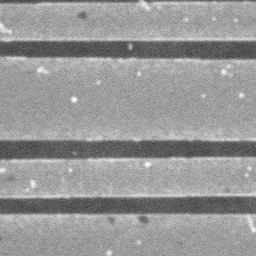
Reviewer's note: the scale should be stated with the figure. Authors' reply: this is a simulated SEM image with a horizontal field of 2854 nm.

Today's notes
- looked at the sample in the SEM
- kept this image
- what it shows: lines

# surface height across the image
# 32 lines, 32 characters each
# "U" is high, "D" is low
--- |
DDDDDUUUUUUUUUUUUUUUUUUUUUUUUUUU
UUUUUUUUUUUUUUUUUUUUUUUUUUUUUUUU
UUUUUUUUUUUUUUUUUUUUUUUUUUUUUUUU
UUUUUUUUUUUUUUUUUUUUUUUUUUUUUUUU
UUUUUUUUUUUUUUUUUUUUUUUUUUUUUUUU
DDDDDDDDDDDDDDDDDDDDDDDDDDDDDDDD
DDDDDDDDDDDDDDDDDDDDDDDDDDDDDDDD
UUUUUUUUUUUUUUUUUUUUUUUUUDDDDDDD
UUUUUUUUUUUUUUUUUUUUUUUUUUUUUUUU
UUUUUUUUUUUUUUUUUUUUUUUUUUUUUUUU
UUUUUUUUUUUUUUUUUUUUUUUUUUUUUUUU
UUUUUUUUUUUUUUUUUUUUUUUUUUUUUUUU
UUUUUUUUUUUUUUUUUUUUUUUUUUUUUUUU
UUUUUUUUUUUUUUUUUUUUUUUUUUUUUUUU
UUUUUUUUUUUUUUUUUUUUUUUUUUUUUUUU
UUUUUUUUUUUUUUUUUUUUUUUUUUUUUUUU
UUUUUUUUUUUUUUUUUUUUUUUUUUUUUUUU
DDDDDDDDDDUUUDDDUUDDDDDUDUUUUUDU
DDDDDDDDDDDDDDDDDDDDDDDDDDDDDDDD
DDDDDDDDDDDDDDDDDDDDDDDDDDDDDDDD
UUUUUUUUUUUUUUUUUUUUUUUUUUUUUUUU
UUUUUUUUUUUUUUUUUUUUUUUUUUUUUUUU
UUUUUUUUUUUUUUUUUUUUUUUUUUUUUUUU
UUUUUUUUUUUUUUUUUUUUUUUUUUUUUUUU
UUUUUUUUUUUUUUUUUUUUUUUUDDDDDDDD
DDDDDDDDDDDDDDDDDDDDDDDDDDDDDDDD
DDDDDDDDDDDDDDDDDDDDDDDDDDDDDDDD
UUUUUUUUUUUUUUUUUUUUUUUUUUUUUUUU
UUUUUUUUUUUUUUUUUUUUUUUUUUUUUUUU
UUUUUUUUUUUUUUUUUUUUUUUUUUUUUUUU
UUUUUUUUUUUUUUUUUUUUUUUUUUUUUUUU
UUUUUUUUUUUUUUUUUUUUUUUUUUUUUUUU